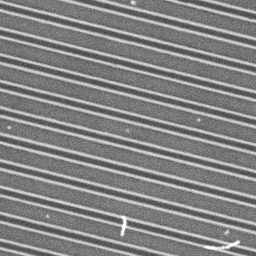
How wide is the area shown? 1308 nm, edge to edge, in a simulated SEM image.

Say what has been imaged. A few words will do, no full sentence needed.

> parallel lines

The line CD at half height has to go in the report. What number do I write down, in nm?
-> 44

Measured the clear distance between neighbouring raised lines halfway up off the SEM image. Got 87.9 nm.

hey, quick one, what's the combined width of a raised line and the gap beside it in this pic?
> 25.6 pixels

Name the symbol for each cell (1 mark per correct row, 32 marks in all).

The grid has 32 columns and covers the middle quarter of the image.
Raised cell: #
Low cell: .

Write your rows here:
.............#########..........
.................#########......
###..................#########..
#######..................#######
...########..................###
.......########.................
...........########.............
...............########.........
#..................########.....
#####..................########.
#########..................#####
....#########..................#
........#########...............
............#########...........
................#########.......
##..................#########...
######..................########
...#######..................####
.......#######..................
...........#######..............
..............########..........
...................#######......
####...................#######..
########..................######
...#########..................##
........########................
............########............
................########........
#...................########....
#####...................########
.########...................####
.....########...................